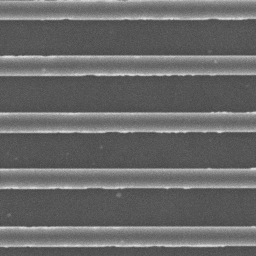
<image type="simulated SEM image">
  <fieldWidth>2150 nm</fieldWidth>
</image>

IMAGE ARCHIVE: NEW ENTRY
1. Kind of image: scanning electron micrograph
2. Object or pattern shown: lines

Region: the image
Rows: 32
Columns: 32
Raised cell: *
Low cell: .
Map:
********************************
********************************
................................
................................
................................
................................
................................
********************************
********************************
................................
................................
................................
................................
................................
********************************
********************************
**************.**..*****...*....
................................
................................
................................
................................
********************************
********************************
***********..***....*..*........
................................
................................
................................
................................
********************************
********************************
********************************
................................